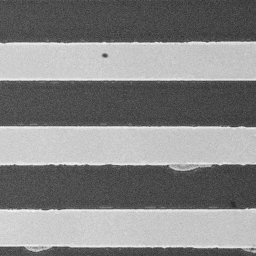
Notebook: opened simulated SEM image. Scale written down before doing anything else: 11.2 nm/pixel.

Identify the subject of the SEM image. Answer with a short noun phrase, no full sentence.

lines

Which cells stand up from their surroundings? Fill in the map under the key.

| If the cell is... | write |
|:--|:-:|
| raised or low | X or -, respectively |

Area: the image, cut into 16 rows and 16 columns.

----------------
----------------
----------------
XXXXXXXXXXXXXXXX
XXXXXXXXXXXXXXXX
----------------
----------------
----------------
XXXXXXXXXXXXXXXX
XXXXXXXXXXXXXXXX
-----------X----
----------------
----------------
XXXXXXXXXXXXXXXX
XXXXXXXXXXXXXXXX
--X------------X